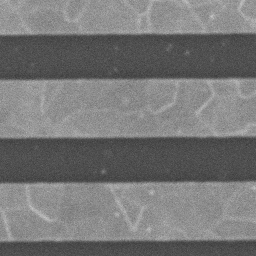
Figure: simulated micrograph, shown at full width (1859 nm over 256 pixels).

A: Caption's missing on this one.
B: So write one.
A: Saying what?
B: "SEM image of wiring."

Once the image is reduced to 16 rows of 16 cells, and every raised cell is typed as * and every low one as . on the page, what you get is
****************
****************
................
................
................
****************
****************
****************
**********..***.
................
................
****************
****************
****************
****************
................